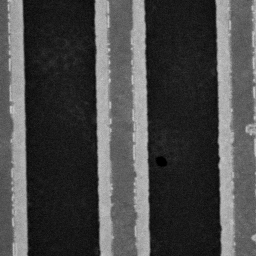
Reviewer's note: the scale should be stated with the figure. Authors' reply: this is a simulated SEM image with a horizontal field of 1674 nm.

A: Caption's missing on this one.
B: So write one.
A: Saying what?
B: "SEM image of one or a few lines or trenches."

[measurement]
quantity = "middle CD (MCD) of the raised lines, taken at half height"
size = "258 nm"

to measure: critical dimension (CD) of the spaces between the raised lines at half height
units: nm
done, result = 536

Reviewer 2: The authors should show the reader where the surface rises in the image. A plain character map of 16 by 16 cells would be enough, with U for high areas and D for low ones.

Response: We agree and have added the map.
UDDDDDUUUDDDDDUU
UDDDDDUUUDDDDDUU
UDDDDDUUUDDDDDUU
UDDDDDUUUDDDDDUU
UDDDDDUUUDDDDDUU
UDDDDDUUUDDDDDUU
UDDDDDUUUDDDDDUU
UDDDDDUUUDDDDDUU
UDDDDDUUUDDDDDUU
UDDDDDUUUDDDDDUU
UDDDDDUUUDDDDDUU
UDDDDDUUUDDDDDUU
UDDDDDUUUDDDDDUU
UDDDDDDUUDDDDDUU
UDDDDDDUUDDDDDUU
UDDDDDDUUDDDDDUU